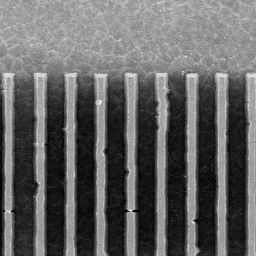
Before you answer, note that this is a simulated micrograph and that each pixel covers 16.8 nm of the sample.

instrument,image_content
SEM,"parallel lines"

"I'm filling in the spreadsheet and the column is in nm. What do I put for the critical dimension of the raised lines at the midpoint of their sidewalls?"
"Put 164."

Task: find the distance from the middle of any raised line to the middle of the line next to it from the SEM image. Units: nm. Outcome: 512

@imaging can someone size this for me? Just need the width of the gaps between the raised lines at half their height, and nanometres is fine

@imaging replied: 346